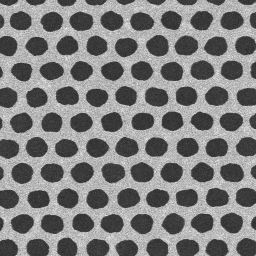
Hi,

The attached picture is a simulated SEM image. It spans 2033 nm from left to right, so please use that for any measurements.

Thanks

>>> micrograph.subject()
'a regular array of holes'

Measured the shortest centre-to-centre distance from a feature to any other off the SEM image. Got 0.229 um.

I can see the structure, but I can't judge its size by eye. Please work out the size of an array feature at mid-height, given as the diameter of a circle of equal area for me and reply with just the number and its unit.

165 nm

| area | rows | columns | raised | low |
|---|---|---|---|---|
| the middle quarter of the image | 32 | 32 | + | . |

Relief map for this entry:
++.....+++....+++.....+++....+++
++.....++......++.....++......++
++.....+++.....++.....++......++
++....++++....++++...++++....+++
++++++++++++++++++++++++++++++++
++++++++++++++++++++++++++++++++
...+++....+++.....+++....+++....
....++.....++.....++......++....
....+......++.....++......++....
...+++.....++.....+++.....++....
+++++++..++++++++++++++..+++++.+
++++++++++++++++++++++++++++++++
+++...+++++...++++...++++....+++
++.....++.....+++.....++......++
++.....++......++......+......++
++.....+++.....++.....++......++
++....++++....++++..++++++..++++
++++++++++++++++++++++++++++++++
+++++++++++++++.++++++.+++++++++
...+++....+++.....+++.....+++...
...+++.....++.....++......++....
....++.....++......+......++....
...+++....+++.....+++....++++...
.+++++++++++++++++++++++++++++++
++++++++++++++++++++++++++++++++
+++....+++....+++....++++....+++
++.....++......++.....++......++
++.....++......++.....++......++
++.....+++.....++.....+++....+++
+++...+++++..+++++...+++++..++++
++++++++++++++++++++++++++++++++
..+++++...+++++...++++...+++++..